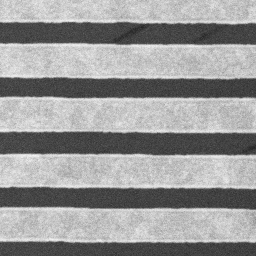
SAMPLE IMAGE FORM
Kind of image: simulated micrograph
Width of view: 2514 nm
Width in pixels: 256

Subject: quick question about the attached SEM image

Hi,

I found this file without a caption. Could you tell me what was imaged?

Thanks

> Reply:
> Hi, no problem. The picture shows lines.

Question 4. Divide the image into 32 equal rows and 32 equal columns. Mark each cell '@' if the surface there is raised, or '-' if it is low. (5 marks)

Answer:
@@@@@@@@@@@@@@@@@@@@@@@@@@@@@@@@
@@@@@@@@@@@@@@@@@@@@@@@@@@@@@@@@
@@@@@@@@@@@@@@@@@@@@@@@@@@@@@@@@
--------------------------------
--------------------------------
--------------------------------
@@@@@@@@@@@@@@@@@@@@@@@@@@@@@@@@
@@@@@@@@@@@@@@@@@@@@@@@@@@@@@@@@
@@@@@@@@@@@@@@@@@@@@@@@@@@@@@@@@
@@@@@@@@@@@@@@@@@@@@@@@@@@@@@@@@
--------------------------------
--------------------------------
@@@@@@@@@@@@@@@@@@@@@@@@@@@@@@@@
@@@@@@@@@@@@@@@@@@@@@@@@@@@@@@@@
@@@@@@@@@@@@@@@@@@@@@@@@@@@@@@@@
@@@@@@@@@@@@@@@@@@@@@@@@@@@@@@@@
--------------------------------
--------------------------------
--------------------------------
@@-@@@@@@@@@--------------------
@@@@@@@@@@@@@@@@@@@@@@@@@@@@@@@@
@@@@@@@@@@@@@@@@@@@@@@@@@@@@@@@@
@@@@@@@@@@@@@@@@@@@@@@@@@@@@@@@@
--------------------------------
--------------------------------
--------------------------------
@@@@@@@@@@@@@@@@@@@@@@@@@@@@@@@@
@@@@@@@@@@@@@@@@@@@@@@@@@@@@@@@@
@@@@@@@@@@@@@@@@@@@@@@@@@@@@@@@@
@@@@@@@@@@@@@@@@@@@@@@@@@@@@@@@@
--------------------------------
--------------------------------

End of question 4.